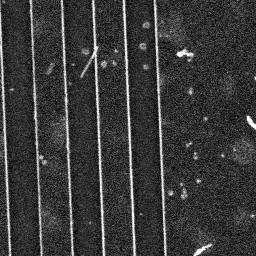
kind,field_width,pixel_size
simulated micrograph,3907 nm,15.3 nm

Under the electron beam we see one or a few lines or trenches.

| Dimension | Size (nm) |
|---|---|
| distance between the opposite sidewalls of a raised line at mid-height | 478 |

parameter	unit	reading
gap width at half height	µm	0.465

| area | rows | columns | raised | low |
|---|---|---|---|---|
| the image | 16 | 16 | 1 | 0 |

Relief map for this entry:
0011001100111111
0011001100111111
0011001100111111
0011001100111111
0011001100111111
0011001100111111
0011001100111111
0011001100111111
0011001100111111
0011001100111111
0011001100111111
0011001100111111
0011001100111111
1011001100111111
1001001100111111
1001101100111111